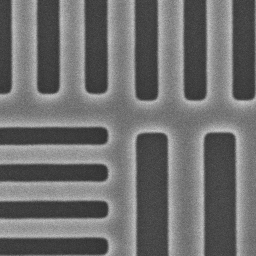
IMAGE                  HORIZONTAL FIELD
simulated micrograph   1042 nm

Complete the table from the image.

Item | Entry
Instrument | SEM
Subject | groups of lines, slits or small figures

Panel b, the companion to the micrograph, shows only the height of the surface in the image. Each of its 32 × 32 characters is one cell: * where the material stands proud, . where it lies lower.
.****..***....***...***...***...
.****..***...****...***...***...
.****..****..****...***...***...
.****..****...***...***...***...
..***...***..****...***...***...
..***...***...***...***...***...
..***...***...***...***...***...
..***...***...***...***...***...
..***...***...***...***...***...
..***...***...***...***...***...
.****..****...***...***...***...
.****..****..****...***...***...
*****************..****..*****.*
********************************
********************************
********************************
.............*****..******...***
.............****....*****....**
*****************....****.....**
*****************....****.....**
.............****....****.....**
..............***....****.....**
.............****....****.....**
*****************....****.....**
*****************....****.....**
.............****....****.....**
..............***....*****....**
*****************....*****....**
*****************....****.....**
*****************....****.....**
..............***....****.....**
.............****....****.....**